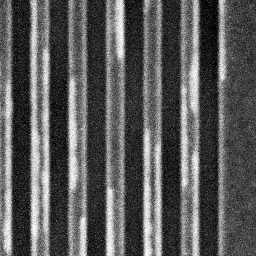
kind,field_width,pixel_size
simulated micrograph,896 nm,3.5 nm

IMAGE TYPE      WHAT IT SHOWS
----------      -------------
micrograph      parallel lines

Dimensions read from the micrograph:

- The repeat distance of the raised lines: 132 nanometers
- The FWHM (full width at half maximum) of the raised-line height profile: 56.4 nm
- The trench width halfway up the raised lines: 0.0752 micrometres